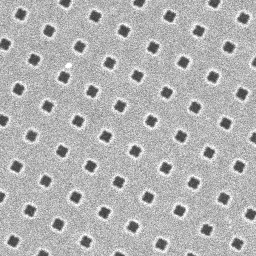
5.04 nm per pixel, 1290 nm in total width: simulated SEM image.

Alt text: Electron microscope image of a regular array of holes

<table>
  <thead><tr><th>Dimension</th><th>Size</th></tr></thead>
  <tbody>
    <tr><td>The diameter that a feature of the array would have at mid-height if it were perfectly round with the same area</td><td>61.6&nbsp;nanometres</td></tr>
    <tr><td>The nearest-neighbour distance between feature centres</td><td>164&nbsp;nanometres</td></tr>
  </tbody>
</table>